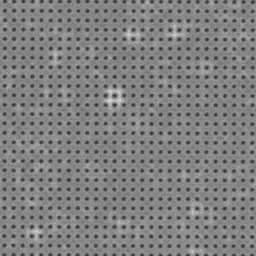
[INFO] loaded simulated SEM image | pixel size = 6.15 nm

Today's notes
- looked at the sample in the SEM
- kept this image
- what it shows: a regular array of holes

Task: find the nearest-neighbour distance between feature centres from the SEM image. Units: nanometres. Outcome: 55.2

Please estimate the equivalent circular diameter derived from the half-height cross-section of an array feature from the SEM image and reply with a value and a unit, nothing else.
0.026 micrometres